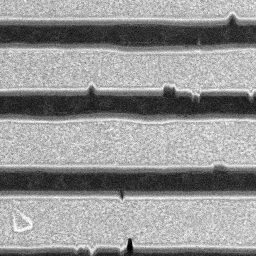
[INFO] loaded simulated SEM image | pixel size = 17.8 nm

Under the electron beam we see one or a few lines or trenches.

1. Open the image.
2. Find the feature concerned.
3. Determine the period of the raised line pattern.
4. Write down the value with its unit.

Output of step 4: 1350 nanometers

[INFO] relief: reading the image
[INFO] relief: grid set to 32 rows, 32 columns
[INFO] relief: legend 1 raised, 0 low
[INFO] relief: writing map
11111111111111111111111111111111
11111111111111111111111111111111
11111111111111111111111111110011
00000000000000000000000000000000
00000000000000000000000000000000
00000000000000000000000000000000
11111111111111111111111111111111
11111111111111111111111111111111
11111111111111111111111111111111
11111111111111111111111111111111
11111111111111111111111111111111
00000000000000000000001111111111
00000000000000000000000000000000
00000000000000000000000000000000
00000000000000000000000000000000
11111111111111111111111111111111
11111111111111111111111111111111
11111111111111111111111111111111
11111111111111111111111111111111
11111111111111111111111111111111
11111111111111111111111111111111
00000000000000000000000000000000
00000000000000000000000000000000
00000000000000000000000000000000
11111111111111111111111111111111
11111111111111111111111111111111
11111111111111111111111111111111
11111111111111111111111111111111
11111111111111111111111111111111
11111111111111111111111111111111
11111111111111110111111111111111
00000000000100000000000000000000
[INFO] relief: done